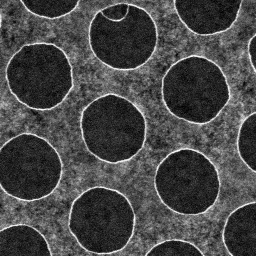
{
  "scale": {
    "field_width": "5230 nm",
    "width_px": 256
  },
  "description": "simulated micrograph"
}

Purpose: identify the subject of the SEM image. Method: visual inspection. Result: raised bodies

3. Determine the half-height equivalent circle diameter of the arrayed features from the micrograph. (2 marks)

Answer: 1360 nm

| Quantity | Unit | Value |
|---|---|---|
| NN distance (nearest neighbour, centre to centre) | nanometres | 1850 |